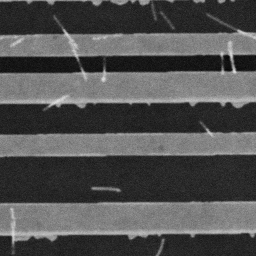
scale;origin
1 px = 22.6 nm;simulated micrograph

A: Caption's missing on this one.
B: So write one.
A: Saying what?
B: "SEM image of lines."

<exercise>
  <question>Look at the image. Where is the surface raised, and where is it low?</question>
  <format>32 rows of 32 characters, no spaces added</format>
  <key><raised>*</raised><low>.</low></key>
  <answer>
................................
................................
................................
................................
********************************
********************************
********************************
................................
................................
********************************
********************************
********************************
********************************
................................
................................
................................
................................
********************************
********************************
................................
................................
................................
................................
................................
................................
********************************
********************************
********************************
********************************
.*..............................
................................
................................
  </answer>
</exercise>